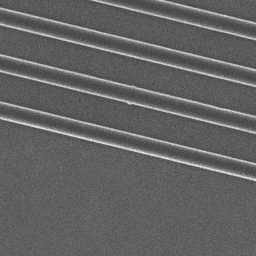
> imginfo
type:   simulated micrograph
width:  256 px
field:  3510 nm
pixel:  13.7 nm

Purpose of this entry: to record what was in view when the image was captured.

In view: parallel lines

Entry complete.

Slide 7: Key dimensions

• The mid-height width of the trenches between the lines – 0.408 um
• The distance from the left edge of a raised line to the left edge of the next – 625 nanometers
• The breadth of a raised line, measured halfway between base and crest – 216 nm